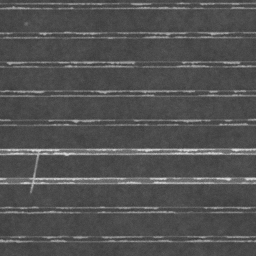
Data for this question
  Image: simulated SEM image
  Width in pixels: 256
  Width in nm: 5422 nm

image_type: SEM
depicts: parallel lines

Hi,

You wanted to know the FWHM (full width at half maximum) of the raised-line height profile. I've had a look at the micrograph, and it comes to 119 nm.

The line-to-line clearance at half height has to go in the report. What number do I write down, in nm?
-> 500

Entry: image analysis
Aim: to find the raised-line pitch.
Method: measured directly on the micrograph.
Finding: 617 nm